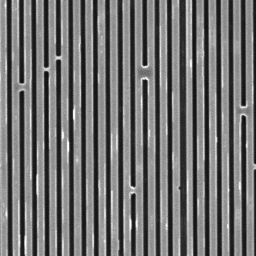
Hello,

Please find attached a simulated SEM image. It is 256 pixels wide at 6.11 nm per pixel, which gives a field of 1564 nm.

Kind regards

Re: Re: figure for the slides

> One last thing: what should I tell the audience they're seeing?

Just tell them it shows parallel lines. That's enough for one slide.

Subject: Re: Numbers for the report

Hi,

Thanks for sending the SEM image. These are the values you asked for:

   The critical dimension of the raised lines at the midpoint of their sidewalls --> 7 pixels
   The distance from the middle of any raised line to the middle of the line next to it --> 75.3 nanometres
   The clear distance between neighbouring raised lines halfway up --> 31.3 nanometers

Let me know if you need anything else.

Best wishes